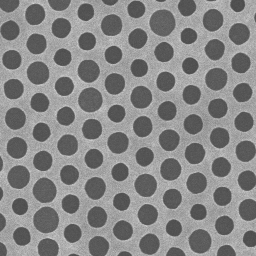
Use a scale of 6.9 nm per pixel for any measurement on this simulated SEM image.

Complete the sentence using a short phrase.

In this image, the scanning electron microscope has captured a regular array of holes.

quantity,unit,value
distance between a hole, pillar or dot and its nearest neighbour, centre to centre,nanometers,201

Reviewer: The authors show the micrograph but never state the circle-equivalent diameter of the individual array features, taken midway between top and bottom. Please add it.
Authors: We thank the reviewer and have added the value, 134 nanometers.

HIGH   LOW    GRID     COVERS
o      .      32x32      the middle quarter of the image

oooo.....oooooooo....ooooooooo..
ooo......oooooooo....ooooooooo..
oooo.....ooo..ooo...oooo...oooo.
.ooo....oo.....oooooooo.....oooo
..ooo..ooo.....oooooooo.....oooo
..oooooooo.....oooo.ooo.....ooo.
..ooo...ooo....oo....ooo...ooo..
.ooo.....ooo..ooo.....oooooooo..
oooo......ooooooo.....oooooooo..
ooo.......ooooooo.....ooo..ooo..
oooo.....ooo..oooo...ooo....oooo
..ooo...ooo....oooooooo.....oooo
...oooooooo....ooooooooo....oooo
...oooooooo....oooo..ooo...ooo..
..ooo....ooo..oooo....oooooooo..
ooooo....oooooooo.....oooooooo..
ooooo.....ooooooo.....oooo.ooo..
ooooo....ooo...ooo...ooo....oooo
...oo...ooo.....oooooooo.....ooo
...oooooooo.....oooooooo.....ooo
...oooooooo.....oooooooo....ooo.
...oooo..ooo...oooo...ooo..ooo..
...ooo...ooooooooo....oooooooo..
ooooo.....oooooooo....oooooooo..
ooooo.....oooooooo....ooo....oo.
..oooo...oooo...oooo.ooo.....ooo
...ooooooooo....oooooooo.....ooo
....oooooooo....oooo.ooo.....ooo
....ooo..ooo....oo.....oo...ooo.
...ooo....oooooooo.....oooooooo.
ooooo.....oooooooo.....oooooooo.
ooooo.....oooooooo.....ooo..ooo.